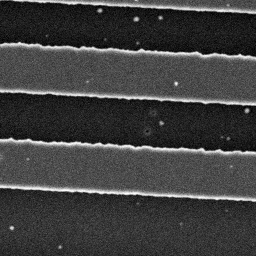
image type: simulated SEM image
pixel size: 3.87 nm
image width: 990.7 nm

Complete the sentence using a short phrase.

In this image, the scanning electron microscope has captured lines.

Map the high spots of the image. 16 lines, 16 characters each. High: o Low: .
.........ooooooo
................
................
ooooooooooooooo.
oooooooooooooooo
oooooooooooooooo
..............oo
................
................
ooooooooooooooo.
oooooooooooooooo
oooooooooooooooo
...............o
................
................
................